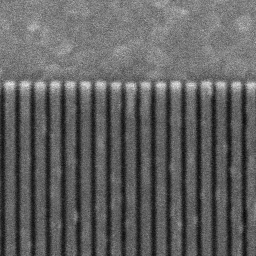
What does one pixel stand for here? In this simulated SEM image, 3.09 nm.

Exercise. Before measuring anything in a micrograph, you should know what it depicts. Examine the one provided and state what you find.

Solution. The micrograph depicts parallel lines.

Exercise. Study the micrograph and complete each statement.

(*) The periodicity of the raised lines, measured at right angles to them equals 0.0465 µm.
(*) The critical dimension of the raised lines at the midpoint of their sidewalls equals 27.8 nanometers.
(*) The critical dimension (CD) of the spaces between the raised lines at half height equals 5.86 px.